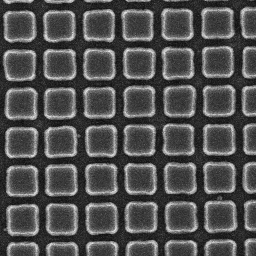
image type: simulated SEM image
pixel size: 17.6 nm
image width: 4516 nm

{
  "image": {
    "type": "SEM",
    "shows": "a regular array of raised bodies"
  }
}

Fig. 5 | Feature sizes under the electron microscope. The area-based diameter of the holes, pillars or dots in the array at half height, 0.577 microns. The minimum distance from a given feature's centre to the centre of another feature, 678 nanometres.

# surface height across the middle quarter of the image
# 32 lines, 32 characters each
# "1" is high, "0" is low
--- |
11100111111100011111110001111111
11100111111110011111110001111111
11100111111100011111110001111111
11000011111100000000100001100000
00000000000000000000000000000000
00000000000000000000000000000000
11000011111100001111110001111111
11100111111110011111110001111111
11100111111110011111110001111111
11100111111110011111110001111111
11100111111110011111110001111111
11100111111110011111110001111111
11100111111100011111110000111111
00000000000000000000000000000000
00000000000000000000000000000000
00000000001100000000000000111110
11000011111110011111110001111111
11100011111110011111111001111111
11100011111110001111110001111111
11100011111110011111111001111111
11100011111110011111111001111111
11100011111110011111111001111111
11100011111110001111100000011011
00000000000000000000000000000000
00000000000000000000000000000000
11000011111100001111110000111111
11100011111110011111111001111111
11100011111110011111111001111111
11100011111110011111111001111111
11100011111110011111111000111111
11100011111110011111111000111111
11100011111110001111111000111111